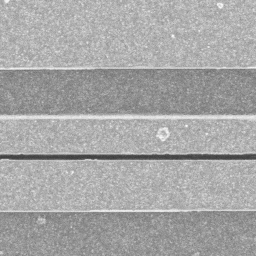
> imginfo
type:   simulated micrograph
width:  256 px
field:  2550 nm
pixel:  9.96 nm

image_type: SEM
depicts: lines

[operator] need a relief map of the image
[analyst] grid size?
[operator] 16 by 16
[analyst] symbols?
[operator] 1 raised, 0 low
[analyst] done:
1111111111111111
1111111111111111
1111111111111111
1111111111111111
0000000000000000
0000000000000000
0000000000000000
1111111111111111
1111111111111111
1111111111111111
1111111111111111
1111111111111111
1111111111111111
0000000000000000
0000000000000000
0000000000000000